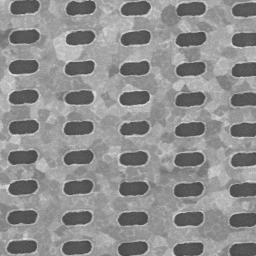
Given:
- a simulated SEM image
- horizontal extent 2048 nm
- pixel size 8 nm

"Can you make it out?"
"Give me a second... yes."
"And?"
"a regular array of holes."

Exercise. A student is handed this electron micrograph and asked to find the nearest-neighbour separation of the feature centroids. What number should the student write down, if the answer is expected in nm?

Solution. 240